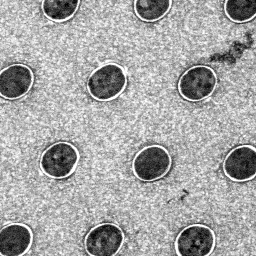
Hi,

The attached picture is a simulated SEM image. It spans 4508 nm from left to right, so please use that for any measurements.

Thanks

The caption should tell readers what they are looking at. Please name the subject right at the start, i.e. raised bodies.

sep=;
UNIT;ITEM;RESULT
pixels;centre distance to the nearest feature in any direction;91.1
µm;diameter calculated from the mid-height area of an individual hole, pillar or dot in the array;0.634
